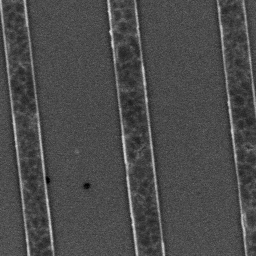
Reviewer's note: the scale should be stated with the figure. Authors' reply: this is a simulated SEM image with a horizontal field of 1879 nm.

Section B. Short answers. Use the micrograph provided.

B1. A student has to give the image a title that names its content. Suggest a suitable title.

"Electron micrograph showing one or a few lines or trenches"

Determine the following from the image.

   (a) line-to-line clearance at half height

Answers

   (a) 599 nm